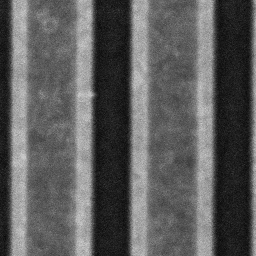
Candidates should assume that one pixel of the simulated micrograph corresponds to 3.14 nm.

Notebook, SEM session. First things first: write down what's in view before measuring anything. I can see one or a few lines or trenches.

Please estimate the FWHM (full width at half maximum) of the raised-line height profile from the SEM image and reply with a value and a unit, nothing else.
207 nanometres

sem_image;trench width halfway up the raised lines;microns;0.171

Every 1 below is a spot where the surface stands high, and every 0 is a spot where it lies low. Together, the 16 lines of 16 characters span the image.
0111100001111000
0111100001111000
0111100001111000
0111100001111000
0111100001111000
0111100001111000
0111100001111000
0111100001111000
0111100001111000
0111100001111000
0111100001111000
0111100001111000
0111100001111000
0111100001111000
0111100001111000
0111100001111000